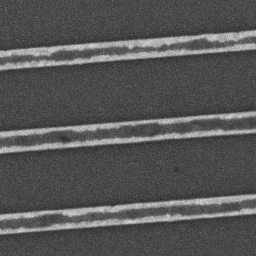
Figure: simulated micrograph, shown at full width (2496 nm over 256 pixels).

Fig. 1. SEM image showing one or a few lines or trenches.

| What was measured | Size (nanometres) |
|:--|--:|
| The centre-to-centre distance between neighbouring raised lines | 798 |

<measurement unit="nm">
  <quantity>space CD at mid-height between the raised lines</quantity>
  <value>622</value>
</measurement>